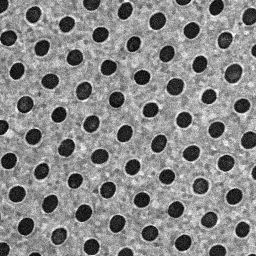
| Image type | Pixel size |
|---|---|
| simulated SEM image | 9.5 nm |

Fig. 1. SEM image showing a regular array of holes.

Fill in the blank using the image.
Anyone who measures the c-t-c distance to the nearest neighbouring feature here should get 320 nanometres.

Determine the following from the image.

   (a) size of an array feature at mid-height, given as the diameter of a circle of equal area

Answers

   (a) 162 nm